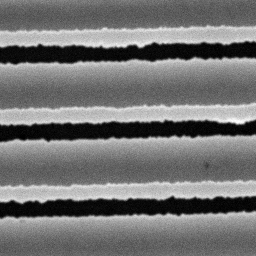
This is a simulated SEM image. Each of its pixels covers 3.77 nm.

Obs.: lines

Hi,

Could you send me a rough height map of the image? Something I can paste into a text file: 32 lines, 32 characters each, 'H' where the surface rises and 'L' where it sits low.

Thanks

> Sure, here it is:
HHHHHHHHHHHHHHHHHHHHHHHHHHHHHHHH
HHHHHHHHHHHHHHHHHHHHHHHHHHHHHHHH
HHHHHHHHHHHHHHHHHHHHHHHHHHHHHHHH
HHHHHHHHHHHHHHHHHHHHHHHHHHHHHHHH
HHHHHHHHHHHHHHHHHHHHHHHHHHHHHHHH
HHHHHHHHHHHHHHHHHHHLLLLLLLLLLLLL
LLLLLLLLLLLLLLLLLLLLLLLLLLLLLLLL
LLLLLLLLLLLLLLLLLLLLLHHLHHHHHHHH
HHHHHHHHHHHHHHHHHHHHHHHHHHHHHHHH
HHHHHHHHHHHHHHHHHHHHHHHHHHHHHHHH
HHHHHHHHHHHHHHHHHHHHHHHHHHHHHHHH
HHHHHHHHHHHHHHHHHHHHHHHHHHHHHHHH
HHHHHHHHHHHHHHHHHHHHHHHHHHHHHHHH
HHHHHHHHHHHHHHHHHHHHHHHHHHHHHHHH
HHHHHHHHHHHHHHHHHHHHHHHHHHHHHHHH
HHLHLLLLLLLLLLLLLLLLLLLLLLLLLLLL
LLLLLLLLLLLLLLLLLLLLLLLLLLLLLLLL
LLLLLLLLLLHLHHHHHHHHHHHHHHHHHHHH
HHHHHHHHHHHHHHHHHHHHHHHHHHHHHHHH
HHHHHHHHHHHHHHHHHHHHHHHHHHHHHHHH
HHHHHHHHHHHHHHHHHHHHHHHHHHHHHHHH
HHHHHHHHHHHHHHHHHHHHHHHHHHHHHHHH
HHHHHHHHHHHHHHHHHHHHHHHHHHHHHHHH
HHHHHHHHHHHHHHHHHHHHHHHHHHHHHHHH
HHHHHHHHHHHHHHHHHHHHHHHHHHHHHHHH
LLLLLLLLLLLLLLLLLLLLLLLLLLLLLLLL
LLLLLLLLLLLLLLLLLLLLLLLLLLLLLLLL
HHHHHHHHHHHHHHHHHHHHHHHHHHHHHHHH
HHHHHHHHHHHHHHHHHHHHHHHHHHHHHHHH
HHHHHHHHHHHHHHHHHHHHHHHHHHHHHHHH
HHHHHHHHHHHHHHHHHHHHHHHHHHHHHHHH
HHHHHHHHHHHHHHHHHHHHHHHHHHHHHHHH